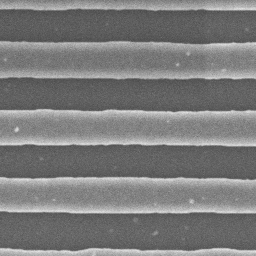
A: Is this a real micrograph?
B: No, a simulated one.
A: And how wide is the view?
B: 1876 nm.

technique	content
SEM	lines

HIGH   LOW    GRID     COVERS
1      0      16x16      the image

1111111111111111
0000000000000000
0000000000000000
1111111111111111
1111111111111111
0000000000000000
0000000000000000
1111111111111111
1111111111111111
0000000000000000
0000000000000000
1111111111111111
1111111111111111
0000000000000000
0000000000000000
0000000000000000